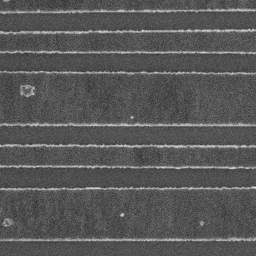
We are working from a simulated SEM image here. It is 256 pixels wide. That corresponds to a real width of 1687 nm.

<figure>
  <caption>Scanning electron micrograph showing lines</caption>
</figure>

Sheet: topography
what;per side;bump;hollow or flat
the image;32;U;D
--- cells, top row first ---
UUUUUUUUUUUUUUUUUUUUUUUUUUUUUUUU
UUUUUUUUUUDDDDDDDDDDDDDDDDDDDDDD
DDDDDDDDDDDDDDDDDDDDDDDDDDDDDDDD
DDDDDDDDDDDDDDDDDDDDDDDDDDDDDDDD
UUUUUUUUUUUUUUUUUUUUUUUUUUUUUUUU
UUUUUUUUUUUUUUUUUUUUUUUUUUUUUUUU
UUUDUUUUUUUUUUUUUUUUUUUUUUUUUUUU
DDDDDDDDDDDDDDDDDDDDDDDDDDDDDDDD
DDDDDDDDDDDDDDDDDDDDDDDDDDDDDDDD
UUUUUUUUUUUUUUUUUUUUUUUUUUUUUUUU
UUUUUUUUUUUUUUUUUUUUUUUUUUUUUUUU
UUUUUUUUUUUUUUUUUUUUUUUUUUUUUUUU
UUUUUUUUUUUUUUUUUUUUUUUUUUUUUUUU
UUUUUUUUUUUUUUUUUUUUUUUUUUUUUUUU
UUUUUUUUUUUUUUUUUUUUUUUUUUUUUUUU
UUUUUUUUUUUUUUUUUUUUUUUUUUUUUUUU
DDDDDDDDDDDDDDDDDDDDDDDDDDDDDDDD
DDDDDDDDDDDDDDDDDDDDDDDDDDDDDDDD
UUUUUUUUUUUUUUUUUUUUUUUUUUUUUUUU
UUUUUUUUUUUUUUUUUUUUUUUUUUUUUUUU
UUUUUUUUUUUUUUUUUUUUUUUUUUUUUUUU
DDDDDDDDDDDDDDDDDDDDDDDDDDDDDDDD
DDDDDDDDDDDDDDDDDDDDDDDDDDDDDDDD
DDDDDDDDDDDDDDDDUUUUDUUUUUUUUUUU
UUUUUUUUUUUUUUUUUUUUUUUUUUUUUUUU
UUUUUUUUUUUUUUUUUUUUUUUUUUUUUUUU
UUUUUUUUUUUUUUUUUUUUUUUUUUUUUUUU
UUUUUUUUUUUUUUUUUUUUUUUUUUUUUUUU
UUUUUUUUUUUUUUUUUUUUUUUUUUUUUUUU
UUUUUUUUUUUUUUUUUUUUUUUUUUUUUUUU
DDDDDDDDDDDDDDDDDDDDDDDDDDDDDDDD
DDDDDDDDDDDDDDDDDDDDDDDDDDDDDDDD